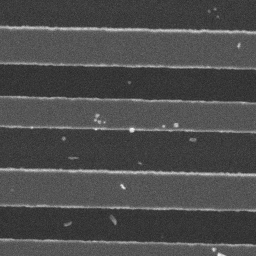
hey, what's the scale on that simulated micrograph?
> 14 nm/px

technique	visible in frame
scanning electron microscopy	lines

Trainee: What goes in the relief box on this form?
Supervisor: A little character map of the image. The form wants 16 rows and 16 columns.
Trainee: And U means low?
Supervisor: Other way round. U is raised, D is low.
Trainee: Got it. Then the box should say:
DDDDDDDDDDDDDDDD
DDDDDDDDDDDDDDDD
UUUUUUUUUUUUUUUU
UUUUUUUUUUUUUUUU
DDDDDDDDDDDDDDDD
DDDDDDDDDDDDDDDD
UUUUUUUUUUUUUUUU
UUUUUUUUUUUUUUUU
DDDDDDDDDDDDDDDD
DDDDDDDDDDDDDDDD
DDDDDDDDDDDDDDDD
UUUUUUUUUUUUUUUU
UUUUUUUUUUUUUUUU
DDDDDDDDDDDDDDDD
DDDDDDDDDDDDDDDD
UUUUUUUUUUUUUUUU